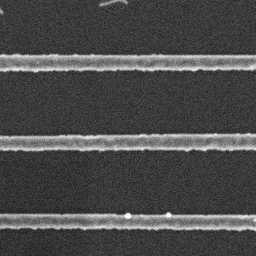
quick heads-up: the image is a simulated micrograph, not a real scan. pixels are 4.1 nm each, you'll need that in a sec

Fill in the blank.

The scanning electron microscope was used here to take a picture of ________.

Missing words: lines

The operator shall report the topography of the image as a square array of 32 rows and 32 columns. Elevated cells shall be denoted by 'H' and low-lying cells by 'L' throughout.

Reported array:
LLLLLLLLLLLLLLLLLLLLLLLLLLLLLLLL
LLLLLLLLLLLLLLLLLLLLLLLLLLLLLLLL
LLLLLLLLLLLLLLLLLLLLLLLLLLLLLLLL
LLLLLLLLLLLLLLLLLLLLLLLLLLLLLLLL
LLLLLLLLLLLLLLLLLLLLLLLLLLLLLLLL
LLLLLLLLLLLLLLLLLLLLLLLLLLLLLLLL
LLLLLLLLLLLLLLLLLLLLLLLLLLLLLLLL
HHHHHHHHHHHHHHHHHHHHHHHLHHHHHHHH
HHHHHHHHHHHHHHHHHHHHHHHHHHHHHHHH
LLLLLLLLLLLLLLLLLLLLLLLLLLLLLLLL
LLLLLLLLLLLLLLLLLLLLLLLLLLLLLLLL
LLLLLLLLLLLLLLLLLLLLLLLLLLLLLLLL
LLLLLLLLLLLLLLLLLLLLLLLLLLLLLLLL
LLLLLLLLLLLLLLLLLLLLLLLLLLLLLLLL
LLLLLLLLLLLLLLLLLLLLLLLLLLLLLLLL
LLLLLLLLLLLLLLLLLLLLLLLLLLLLLLLL
LLLLLLLLLLLLLLLLLLLLLLLLLLLLLLLL
HHHHHHHHHHHHHHHHHHHHHHHHHHHHHHHH
HHHHHHHHHHHHHHHHHHHHHHHHHHHHHHHH
LLLLLLLLLLLLLLLLLLLLLLLLLLLLLLLL
LLLLLLLLLLLLLLLLLLLLLLLLLLLLLLLL
LLLLLLLLLLLLLLLLLLLLLLLLLLLLLLLL
LLLLLLLLLLLLLLLLLLLLLLLLLLLLLLLL
LLLLLLLLLLLLLLLLLLLLLLLLLLLLLLLL
LLLLLLLLLLLLLLLLLLLLLLLLLLLLLLLL
LLLLLLLLLLLLLLLLLLLLLLLLLLLLLLLL
LLLLLLLLLLLLLLLLLLLLLLLLLLLLLLLL
HHHHHHHHHHHHHHHHHHHHHHHHHHHHHHHH
HHHHHHHHHHHHHHHHHHHHHHHHHHHHHHHH
LLLLLLLLLLLLLLLLLLLLLLLLLLLLLLLL
LLLLLLLLLLLLLLLLLLLLLLLLLLLLLLLL
LLLLLLLLLLLLLLLLLLLLLLLLLLLLLLLL